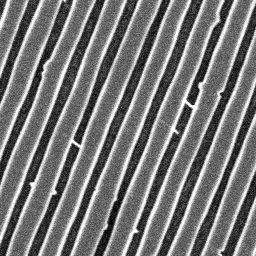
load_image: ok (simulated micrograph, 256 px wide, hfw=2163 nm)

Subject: parallel lines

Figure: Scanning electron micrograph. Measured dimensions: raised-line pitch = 256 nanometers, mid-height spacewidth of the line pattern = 92.4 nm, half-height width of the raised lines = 0.164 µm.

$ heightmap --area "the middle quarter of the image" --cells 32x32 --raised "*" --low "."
*...*****...*****...*****....***
....****....*****...*****...****
....****...******...*****...****
...*****...*****...*****....****
...****...******...*****...*****
...****...*****....****....*****
..*****...*****...*****...*****.
..****...******...****....*****.
.*****...*****...*****...*****..
.*****..******...*****...*****..
******..*****....****...******..
*****...*****...*****...*****...
*****..*****....****...******...
****...*****...*****...*****....
****..*****....*****...*****...*
***...*****....*****..******...*
***...*****...*****...******...*
***..******...*****...*****...**
**...*****...*****...*****....**
**...*****...*****...*****...***
*...*****...*****....*****...***
*...*****...*****...*****...****
*...*****...*****...*****...****
...*****...*****....****...*****
...*****...*****...*****...*****
..*****...******...****....*****
..*****...*****...*****...*****.
..*****...*****...*****...*****.
.*****...*****...*****...*****..
.*****...*****...*****...*****..
.****...******..******...*****..
*****...*****...*****...*****...